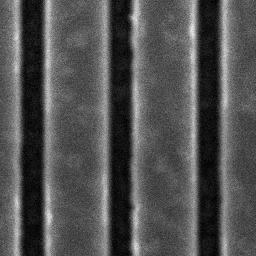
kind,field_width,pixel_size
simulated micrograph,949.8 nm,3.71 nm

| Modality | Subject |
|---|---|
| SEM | one or a few lines or trenches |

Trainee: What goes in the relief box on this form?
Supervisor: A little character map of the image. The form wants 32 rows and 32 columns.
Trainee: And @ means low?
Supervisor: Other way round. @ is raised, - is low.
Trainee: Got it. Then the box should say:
@@@---@@@@@@@@---@@@@@@@@---@@@@
@@@--@@@@@@@@@--@@@@@@@@@---@@@@
@@@---@@@@@@@@--@@@@@@@@@---@@@@
@@@---@@@@@@@@---@@@@@@@@---@@@@
@@@---@@@@@@@@--@@@@@@@@@---@@@@
@@@---@@@@@@@@--@@@@@@@@@---@@@@
@@@---@@@@@@@@---@@@@@@@@---@@@@
@@@---@@@@@@@@---@@@@@@@@---@@@@
@@@---@@@@@@@@---@@@@@@@@---@@@@
@@@---@@@@@@@@---@@@@@@@@---@@@@
@@@---@@@@@@@@---@@@@@@@@---@@@@
@@@---@@@@@@@@---@@@@@@@@---@@@@
@@@---@@@@@@@@--@@@@@@@@@---@@@@
@@@---@@@@@@@@---@@@@@@@@---@@@@
@@@---@@@@@@@@---@@@@@@@@---@@@@
@@@---@@@@@@@@---@@@@@@@@---@@@@
@@@---@@@@@@@@---@@@@@@@@---@@@@
@@@---@@@@@@@@---@@@@@@@@---@@@@
@@@---@@@@@@@@---@@@@@@@@---@@@@
@@@---@@@@@@@@---@@@@@@@@---@@@@
@@@---@@@@@@@@--@@@@@@@@@---@@@@
@@@---@@@@@@@@--@@@@@@@@@---@@@@
@@@---@@@@@@@@--@@@@@@@@@---@@@@
@@@---@@@@@@@@--@@@@@@@@@---@@@@
@@@---@@@@@@@@--@@@@@@@@@---@@@@
@@@---@@@@@@@@--@@@@@@@@@---@@@@
@@@---@@@@@@@@--@@@@@@@@@---@@@@
@@@---@@@@@@@@--@@@@@@@@@---@@@@
@@@---@@@@@@@@--@@@@@@@@@---@@@@
@@@---@@@@@@@@--@@@@@@@@@---@@@@
@@@---@@@@@@@@--@@@@@@@@@---@@@@
@@@---@@@@@@@@--@@@@@@@@@---@@@@